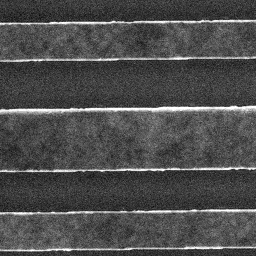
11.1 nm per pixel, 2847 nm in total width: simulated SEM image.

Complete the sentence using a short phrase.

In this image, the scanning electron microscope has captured lines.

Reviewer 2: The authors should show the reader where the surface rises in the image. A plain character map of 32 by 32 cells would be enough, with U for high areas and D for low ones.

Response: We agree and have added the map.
DDDDDDDDDDDDDDDDDDDDDDDDDDDDDDDD
DDDDDDDDDDDDDDDDDDDDDDDDDDDDDDDD
DDDDDDDDDDDDDDDDDDDDDDDDDDDDDDDD
UUUUUUUUUUUUUUUUUUUUUUUUUUUUUUUU
UUUUUUUUUUUUUUUUUUUUUUUUUUUUUUUU
UUUUUUUUUUUUUUUUUUUUUUUUUUUUUUUU
UUUUUUUUUUUUUUUUUUUUUUUUUUUUUUUU
UUUUUDDDDDDDDDDDDDDDDDDDDDDDDDDD
DDDDDDDDDDDDDDDDDDDDDDDDDDDDDDDD
DDDDDDDDDDDDDDDDDDDDDDDDDDDDDDDD
DDDDDDDDDDDDDDDDDDDDDDDDDDDDDDDD
DDDDDDDDDDDDDDDDDDDDDDDDDDDDDDDD
DDDDDDDDDDDDDDDDDDDDDDDDDDDDDDDD
DDDDDDDDDDDDDDDDDDDDDDDDUUUUUUUU
UUUUUUUUUUUUUUUUUUUUUUUUUUUUUUUU
UUUUUUUUUUUUUUUUUUUUUUUUUUUUUUUU
UUUUUUUUUUUUUUUUUUUUUUUUUUUUUUUU
UUUUUUUUUUUUUUUUUUUUUUUUUUUUUUUU
UUUUUUUUUUUUUUUUUUUUUUUUUUUUUUUU
UUUUUUUUUUUUUUUUUUUUUUUUUUUUUUUU
UUUUUUUUUUUUUUUUUUUUUUUUUUUUUUUU
DDDDDDDDDDDDDDDDDDDDDDDDDDDDDDDD
DDDDDDDDDDDDDDDDDDDDDDDDDDDDDDDD
DDDDDDDDDDDDDDDDDDDDDDDDDDDDDDDD
DDDDDDDDDDDDDDDDDDDDDDDDDDDDDDDD
DDDDDDDDDDDDDDDDDDDDDDDDDDDDDDDD
DDDDDDDDDDDDDDDDDDDUUUUUUUUUUUUU
UUUUUUUUUUUUUUUUUUUUUUUUUUUUUUUU
UUUUUUUUUUUUUUUUUUUUUUUUUUUUUUUU
UUUUUUUUUUUUUUUUUUUUUUUUUUUUUUUU
UUUUUUUUUUUUUUUUUUUUUUUUUUUUUUUU
DDDDDDDDDDDDDDDDDDDDDDDDDDDDDDDD